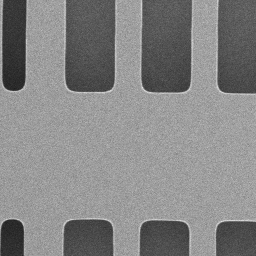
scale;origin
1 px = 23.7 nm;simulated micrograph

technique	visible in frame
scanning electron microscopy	groups of lines, slits or small figures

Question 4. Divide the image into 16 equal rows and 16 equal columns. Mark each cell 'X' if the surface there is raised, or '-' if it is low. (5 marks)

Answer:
--XX---XX---XX--
--XX---XX---XX--
--XX---XX---XX--
--XX---XX---XX--
--XX---XX---XX--
XXXX---XX---XX--
XXXXXXXXXXXXXXXX
XXXXXXXXXXXXXXXX
XXXXXXXXXXXXXXXX
XXXXXXXXXXXXXXXX
XXXXXXXXXXXXXXXX
XXXXXXXXXXXXXXXX
XXXXXXXXXXXXXXXX
XXXXXXXXXXXXXXXX
-XXX---XX---X---
--XX---XX---X---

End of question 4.